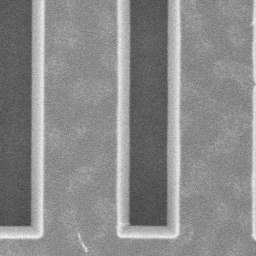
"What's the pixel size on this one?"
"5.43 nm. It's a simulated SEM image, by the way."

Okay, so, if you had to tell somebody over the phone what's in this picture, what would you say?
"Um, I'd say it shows one or a few lines or trenches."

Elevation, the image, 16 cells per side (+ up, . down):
..++++++...+++++
..++++++...+++++
..++++++...+++++
..++++++...+++++
..++++++...+++++
..++++++...+++++
..++++++...+++++
..++++++...+++++
..++++++...+++++
..++++++...+++++
..++++++...+++++
..++++++...+++++
..++++++...+++++
..++++++...+++++
..++++++..++++++
++++++++++++++++